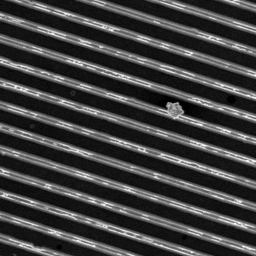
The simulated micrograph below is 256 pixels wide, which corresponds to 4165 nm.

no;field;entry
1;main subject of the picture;parallel lines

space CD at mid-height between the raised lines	242	nm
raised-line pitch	344	nanometres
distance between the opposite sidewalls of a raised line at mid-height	105	nm